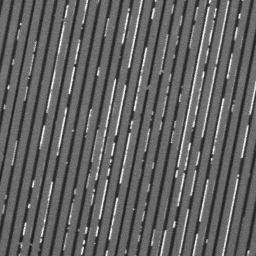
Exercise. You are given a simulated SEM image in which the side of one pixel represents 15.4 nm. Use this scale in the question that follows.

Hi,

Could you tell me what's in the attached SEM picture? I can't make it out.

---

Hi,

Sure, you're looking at parallel lines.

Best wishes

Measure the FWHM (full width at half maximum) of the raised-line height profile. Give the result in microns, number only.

0.115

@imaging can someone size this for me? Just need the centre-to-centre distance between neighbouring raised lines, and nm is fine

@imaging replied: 164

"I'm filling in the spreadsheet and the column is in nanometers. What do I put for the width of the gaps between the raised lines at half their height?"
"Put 51.1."